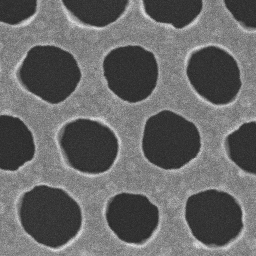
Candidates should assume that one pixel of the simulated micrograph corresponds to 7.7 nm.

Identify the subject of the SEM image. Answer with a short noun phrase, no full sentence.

a regular array of holes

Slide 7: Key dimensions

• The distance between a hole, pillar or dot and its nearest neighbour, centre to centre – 0.615 micrometres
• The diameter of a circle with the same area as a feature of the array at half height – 0.446 micrometres